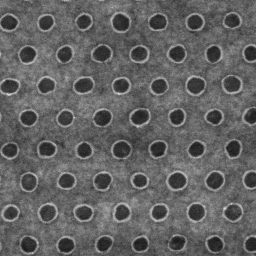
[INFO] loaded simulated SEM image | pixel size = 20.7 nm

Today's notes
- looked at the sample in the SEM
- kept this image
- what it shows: a regular array of raised bodies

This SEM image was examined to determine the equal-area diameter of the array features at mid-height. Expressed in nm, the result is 363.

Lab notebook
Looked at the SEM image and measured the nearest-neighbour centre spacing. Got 750 nm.